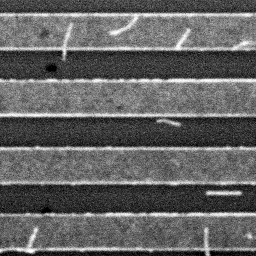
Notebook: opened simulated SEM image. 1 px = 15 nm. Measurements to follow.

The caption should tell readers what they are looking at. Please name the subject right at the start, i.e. lines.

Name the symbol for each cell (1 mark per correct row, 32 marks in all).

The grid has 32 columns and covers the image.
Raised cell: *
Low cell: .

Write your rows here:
................................
................................
********************************
********************************
********************************
********************************
................................
................................
................................
................................
********************************
********************************
********************************
********************************
................................
................................
................................
................................
....*........*..............*.*.
********************************
********************************
********************************
********************************
................................
................................
................................
................................
********************************
********************************
********************************
********************************
................................